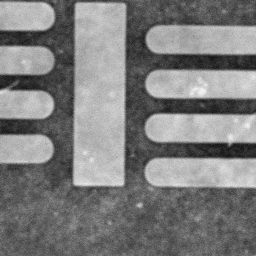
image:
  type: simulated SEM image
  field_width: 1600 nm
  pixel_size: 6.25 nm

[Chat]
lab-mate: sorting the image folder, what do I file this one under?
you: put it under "groups of lines, slits or small figures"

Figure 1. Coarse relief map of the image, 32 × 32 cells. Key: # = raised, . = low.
######....#####.................
#######..#######................
#######..#######................
######...#######...#############
.........#######..##############
.........#######..##############
######...#######...#############
#######..#######................
######...#######................
.........#######...#############
.........#######..##############
#####....#######...#############
#######..#######................
#######..#######................
######...#######...#############
.........#######..##############
.........#######..##############
######...#######...#############
#######..#######................
######...#######................
.........######...##############
.........######...##############
.........######...##############
................................
................................
................................
................................
................................
................................
................................
................................
................................